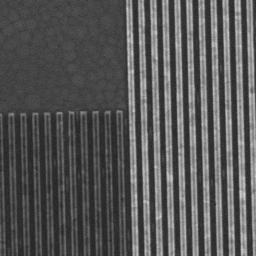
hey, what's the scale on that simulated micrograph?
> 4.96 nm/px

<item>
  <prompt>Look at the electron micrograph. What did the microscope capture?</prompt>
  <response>parallel lines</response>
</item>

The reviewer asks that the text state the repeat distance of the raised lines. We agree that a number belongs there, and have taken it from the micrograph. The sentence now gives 59.8 nanometres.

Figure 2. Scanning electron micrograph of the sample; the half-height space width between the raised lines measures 39.1 nm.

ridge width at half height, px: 4.01